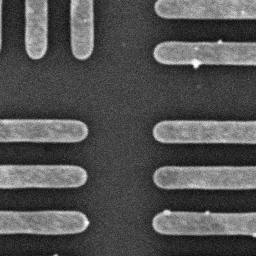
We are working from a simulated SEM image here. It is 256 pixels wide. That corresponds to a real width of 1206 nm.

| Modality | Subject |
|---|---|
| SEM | groups of lines, slits or small figures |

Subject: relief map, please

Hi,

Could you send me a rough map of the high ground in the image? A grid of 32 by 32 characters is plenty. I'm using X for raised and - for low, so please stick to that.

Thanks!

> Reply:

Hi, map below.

---XXX---XXX-------XXXXXXXXXXXXX
---XXX---XXX--------XXXXXXXXXXXX
---XXX---XXX--------------------
---XXX---XXX--------------------
---XXX---XXX--------------------
---XXX---XXX--------XXXXXXXXXXXX
---XXX---XX--------XXXXXXXXXXXXX
--------------------XXXXXXXXXXXX
--------------------------------
--------------------------------
--------------------------------
--------------------------------
--------------------------------
--------------------------------
--------------------------------
XXXXXXXXXX----------XXXXXXXXXXXX
XXXXXXXXXXX--------XXXXXXXXXXXXX
XXXXXXXXXX----------XXXXXXXXXXXX
--------------------------------
--------------------------------
--------------------------------
XXXXXXXXXXX--------XXXXXXXXXXXXX
XXXXXXXXXXX--------XXXXXXXXXXXXX
--------------------XXX--XXXXXXX
--------------------------------
--------------------------------
-----XXXX-----------XX----------
XXXXXXXXXXX--------XXXXXXXXXXXXX
XXXXXXXXXXX--------XXXXXXXXXXXXX
--------------------------------
--------------------------------
--------------------------------